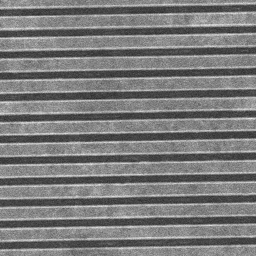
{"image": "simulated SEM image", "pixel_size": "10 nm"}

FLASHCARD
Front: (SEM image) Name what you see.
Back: parallel lines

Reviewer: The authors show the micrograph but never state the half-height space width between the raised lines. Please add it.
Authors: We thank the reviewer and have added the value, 82.6 nm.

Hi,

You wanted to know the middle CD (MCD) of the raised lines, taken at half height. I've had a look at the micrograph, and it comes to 129 nm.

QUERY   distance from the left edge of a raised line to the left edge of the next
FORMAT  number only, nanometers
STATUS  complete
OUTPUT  212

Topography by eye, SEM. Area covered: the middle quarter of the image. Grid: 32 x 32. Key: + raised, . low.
++++++++++++++++++++++++++++++++
+++++++++.......................
................................
..........................++++++
++++++++++++++++++++++++++++++++
++++++++++++++++++++++++++++++++
+++++++++++++++++++++++++.......
................................
................................
++++++++++++++++++++++++++++++++
++++++++++++++++++++++++++++++++
++++++++++++++++++++++++++++++++
................................
................................
....++++++++++++++++++++++++++++
++++++++++++++++++++++++++++++++
++++++++++++++++++++++++++++++++
+++.............................
................................
.......+++++++++....++++++++++++
++++++++++++++++++++++++++++++++
++++++++++++++++++++++++++++++++
+++++++++++++++++++.............
................................
................................
++++++++++++++++++++++++++++++++
++++++++++++++++++++++++++++++++
+++++++++++++++++++++++++++++...
................................
................................
++++++++++++++++++++++++++++++++
++++++++++++++++++++++++++++++++